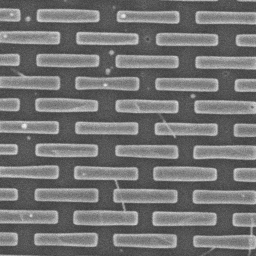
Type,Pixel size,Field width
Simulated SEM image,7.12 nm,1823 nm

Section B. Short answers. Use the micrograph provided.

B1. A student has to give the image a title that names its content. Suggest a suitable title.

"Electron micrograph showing groups of lines, slits or small figures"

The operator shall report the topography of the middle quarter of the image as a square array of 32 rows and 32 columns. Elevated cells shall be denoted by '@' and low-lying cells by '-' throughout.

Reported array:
@@@@@--------@@@@@@@@@@@@@@@----
--------------------------------
--------------------------------
---@@@--------@@@@--------------
---@@@@@@@@@@@@@@@@----@@@@@@@@@
---@@@@@@@@@@@@@@@@----@@@@@@@@@
-----------------------------@@@
--------------------------------
--------------------------------
@@@@@@@@-----@@@@@@@@@@@@@@@----
@@@@@@@@-----@@@@@@@@@@@@@@@----
@@@@@@@@-----@@@@@@@@@@@@@@@----
--------------------------------
--------------------------------
--------------------------------
---@@@@@@@@@@@@@@@-----@@@@@@@@@
---@@@@@@@@@@@@@@@-----@@@@@@@@@
---------------@@@-----@@@@@@@@@
--------------------------------
--------------------------------
@@@@@@@@-----@@@@@@@@@@@@@@@----
@@@@@@@@-----@@@@@@@@@@@@@@@----
@@@@@@@@-----@@@@@@@@@@@@@@@----
-------------------------@@@----
--------------------------------
--------------------------------
---@@@@@@@@@@@@@@@-----@@@@@@@@@
---@@@@@@@@@@@@@@@-----@@@@@@@@@
---@@@@@@@@@@@@@@@-----@@@@@@@@@
--------------------------------
--------------------------------
@@@@@@@@-----@@@@@@@@@----------